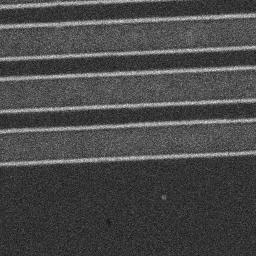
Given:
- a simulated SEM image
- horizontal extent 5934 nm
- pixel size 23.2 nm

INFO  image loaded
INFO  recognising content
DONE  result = parallel lines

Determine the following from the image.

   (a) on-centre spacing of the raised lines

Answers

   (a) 1210 nm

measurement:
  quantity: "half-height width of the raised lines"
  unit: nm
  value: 460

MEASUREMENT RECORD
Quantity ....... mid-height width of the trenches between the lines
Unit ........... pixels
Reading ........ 32.7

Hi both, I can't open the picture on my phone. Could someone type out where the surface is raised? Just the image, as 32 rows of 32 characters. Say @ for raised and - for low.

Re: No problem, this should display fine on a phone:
-------@@@@@@@@@@@@@@@@@@@@@@@@@
@@@@@@@@@@@@@@@@@@@@@@@@@@@@@@@@
@@@@@@@@@@@@@@@@@@@-------------
--------------------------------
--------------------------------
--------------------------------
---------------------@@@@@@@@@@@
@@@@@@@@@@@@@@@@@@@@@@@@@@@@@@@@
@@@@@@@@@@@@@@@@@@@@@@@@@@@@@@@@
@@@@@@@-@@----------------------
--------------------------------
--------------------------------
--------------------------------
----------@@@@@@@@@@@@@@@@@@@@@@
@@@@@@@@@@@@@@@@@@@@@@@@@@@@@@@@
@@@@@@@@@@@@@@@@@@@@------------
--------------------------------
--------------------------------
--------------------------------
----------------------@@@@@@@@@@
--@@@@@@@@@@@@@@@@@@@@@@@@@@@@@@
@@@@@@@@@@@@@@@@@@@@@@@@@@@@@@@@
@@@@@@@@@@@@@@@@@@@@@@@@@@@@@@@@
@@@@@@@@@@@@@@@@@@@@@@@@@@@@@@@@
@@@@@@@@@@@@@@@@@@@@@@@@@@@@@@@@
@@@@@@@@@@@@@@@@@@@@@@@@@@@@@@@@
@@@@@@@@@@@@@@@@@@@@@@@@@@@@@@@@
@@@@@@@@@@@@@@@@@@@@@@@@@@@@@@@@
@@@@@@@@@@@@@@@@@@@@@@@@@@@@@@@@
@@@@@@@@@@@@@@@@@@@@@@@@@@@@@@@@
@@@@@@@@@@@@@@@@@@@@@@@@@@@@@@@@
@@@@@@@@@@@@@@@@@@@@@@@@@@@@@@@@